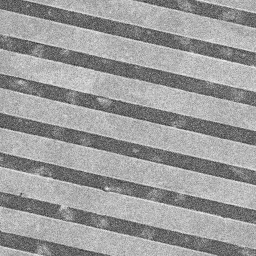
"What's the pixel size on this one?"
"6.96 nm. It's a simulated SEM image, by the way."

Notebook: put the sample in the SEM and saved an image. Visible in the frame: parallel lines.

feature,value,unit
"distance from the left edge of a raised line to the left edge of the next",267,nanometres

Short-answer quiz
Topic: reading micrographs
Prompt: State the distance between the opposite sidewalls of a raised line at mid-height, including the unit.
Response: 23.6 px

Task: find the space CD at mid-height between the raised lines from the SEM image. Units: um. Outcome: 0.102